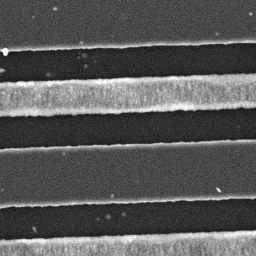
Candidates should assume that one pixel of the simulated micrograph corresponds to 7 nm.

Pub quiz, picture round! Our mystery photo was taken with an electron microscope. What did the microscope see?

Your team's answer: lines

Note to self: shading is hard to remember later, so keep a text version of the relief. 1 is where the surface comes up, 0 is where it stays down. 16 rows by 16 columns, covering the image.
1111111111111111
1111111111111111
1111111111111111
0000000000000000
0000000000000000
1111111111111111
1111111111111111
0000000000000000
0000000000000000
1111111111111111
1111111111111111
1111111111111111
1111111111111000
0000000000000000
0000000000000001
1111111111111111